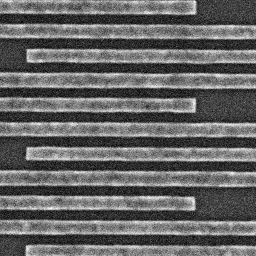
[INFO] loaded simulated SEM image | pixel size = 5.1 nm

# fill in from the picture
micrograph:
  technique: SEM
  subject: wiring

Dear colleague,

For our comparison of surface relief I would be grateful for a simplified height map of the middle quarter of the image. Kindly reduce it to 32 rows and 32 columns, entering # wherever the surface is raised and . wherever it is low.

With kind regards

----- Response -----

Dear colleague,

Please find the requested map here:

................................
................................
##..###.........................
################################
################################
################################
................................
................................
................................
################################
################################
################################
................................
................................
................................
################################
################################
################################
................................
................................
................................
################################
################################
################################
................................
................................
................................
################################
################################
################################
................................
................................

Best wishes